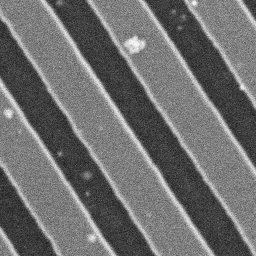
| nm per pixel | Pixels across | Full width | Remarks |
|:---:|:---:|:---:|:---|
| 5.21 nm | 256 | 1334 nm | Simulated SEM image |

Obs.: lines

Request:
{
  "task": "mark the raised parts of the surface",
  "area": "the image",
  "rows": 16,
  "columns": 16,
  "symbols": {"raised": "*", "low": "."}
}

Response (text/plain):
***...***...***.
****..****...***
.****..****..***
..***...***...**
..****..****...*
...***...****..*
*...***...***...
**..****..****..
**...***...****.
***...***...***.
****..****..****
.***...***...***
.****...***...**
..****..****..**
...***...***...*
*..****..****...